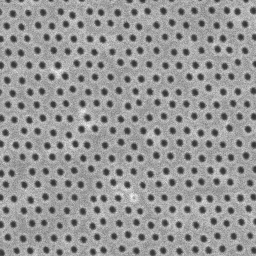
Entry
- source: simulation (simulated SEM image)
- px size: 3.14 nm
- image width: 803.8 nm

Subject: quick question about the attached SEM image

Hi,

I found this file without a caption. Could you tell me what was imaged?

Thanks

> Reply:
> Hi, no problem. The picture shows a regular array of holes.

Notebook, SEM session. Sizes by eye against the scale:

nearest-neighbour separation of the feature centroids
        41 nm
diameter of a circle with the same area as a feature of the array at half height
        20.7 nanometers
